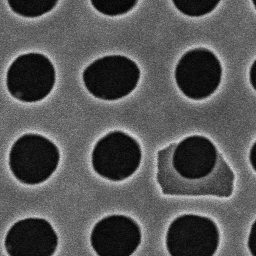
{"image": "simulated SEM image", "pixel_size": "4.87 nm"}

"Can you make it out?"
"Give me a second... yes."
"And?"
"holes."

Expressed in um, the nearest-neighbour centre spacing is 0.389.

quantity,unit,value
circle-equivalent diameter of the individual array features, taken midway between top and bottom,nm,238